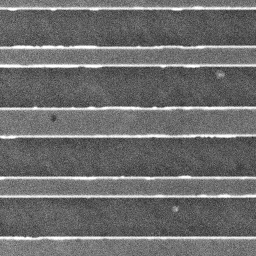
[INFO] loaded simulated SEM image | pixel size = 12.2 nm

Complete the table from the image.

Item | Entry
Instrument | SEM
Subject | lines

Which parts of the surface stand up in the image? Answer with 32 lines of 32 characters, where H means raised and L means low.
HHHHHHHHHHHHHHHHHHHHHHHHHHHHHHHH
LLLLLLLLLLLLLLLLLLLLLLLLLLLLLLLL
LLLLLLLLLLLLLLLLLLLLLLLLLLLLLLLL
LLLLLLLLLLLLLLLLLLLLLLLLLLLLLLLL
LLLLLLLLLLLLLLLLLLLLLLLLLLLLLLLL
LLLLLLLLLLLLLLLLLLLLLLLLLLLLLLLL
HHHHHHHHHHHHHHHHHHHHHHHHHHHHHHHH
HHHHHHHHHHHHHHHHHHHHHHHHHHHHHHHH
LLLLLLLLLLLLLLLLLLLLLLLLLLLLLLLL
LLLLLLLLLLLLLLLLLLLLLLLLLLLLLLLL
LLLLLLLLLLLLLLLLLLLLLLLLLLLLLLLL
LLLLLLLLLLLLLLLLLLLLLLLLLLLLLLLL
LLLLLLLLLLLLLLLLLLLLLLLLLLLLLLLL
LLLLHLLLLLLHLHHHHHLLHHHHHHHHHHHH
HHHHHHHHHHHHHHHHHHHHHHHHHHHHHHHH
HHHHHHHHHHHHHHHHHHHHHHHHHHHHHHHH
HHHHHHHHHHHHHHHHHHHHHHHHHHHHHHHH
LLLLLLLLLLLLLLLLLLLLLLLLLLLLLLLL
LLLLLLLLLLLLLLLLLLLLLLLLLLLLLLLL
LLLLLLLLLLLLLLLLLLLLLLLLLLLLLLLL
LLLLLLLLLLLLLLLLLLLLLLLLLLLLLLLL
LLLLLLLLLLLLLLLLLLLLLLLLLLLLLLLL
HHHHHHHHHHHHHHHHHHHHHHHHHHHHHHHH
HHHHHHHHHHHHHHHHHHHHHHHHHHHHHHHH
HHHHHHHHHHHHHHHHHHHHHHHHHHHHHHHH
LLLLLLLLLLLLLLLLLLLLLLLLLLLLLLLL
LLLLLLLLLLLLLLLLLLLLLLLLLLLLLLLL
LLLLLLLLLLLLLLLLLLLLLLLLLLLLLLLL
LLLLLLLLLLLLLLLLLLLLLLLLLLLLLLLL
LLLLLLLLLLLLLLLLLLLLLLLLLLLLLLLL
HHHHHHHHHHHHHHHHHHHHHHHHHHHHHHHH
HHHHHHHHHHHHHHHHHHHHHHHHHHHHHHHH